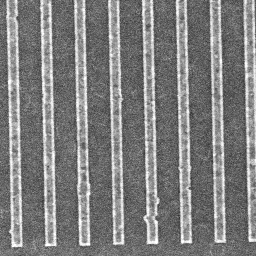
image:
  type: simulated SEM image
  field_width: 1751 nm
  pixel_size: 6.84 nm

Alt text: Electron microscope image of parallel lines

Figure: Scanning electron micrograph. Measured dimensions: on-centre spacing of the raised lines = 232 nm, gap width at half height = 25.4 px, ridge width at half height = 0.0564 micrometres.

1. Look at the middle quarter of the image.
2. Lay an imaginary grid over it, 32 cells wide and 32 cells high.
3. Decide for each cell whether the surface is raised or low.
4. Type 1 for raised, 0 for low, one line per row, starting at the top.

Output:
00011000000011000000110000000110
00011000000011000000110000000110
00011000000011000000110000000110
00011000000011000000110000000110
00011000000011000000110000000110
00011000000011000000110000000110
00011000000011000000110000000110
00011000000011000000110000000110
00011000000011000000110000000110
00011000000011000000110000000110
00011000000011000000110000000110
00011000000011000000110000000110
00011000000011000000110000000110
00011000000011000000111000000110
00011100000011000000011000000110
00001100000011000000011000000110
00001100000011000000011000000110
00001100000011000000011000000110
00001100000011000000011000000110
00001100000011000000011000000110
00001100000011000000011000000110
00001100000011000000011000000110
00001100000011000000011000000110
00001100000011000000011000000110
00001100000011000000011000000110
00001100000011000000011000000110
00001100000011000000011000000110
00001100000011000000011000000110
00001100000011000000011000000110
00001100000011000000011000000110
00001100000011000000011000000110
00001100000011000000011000000110